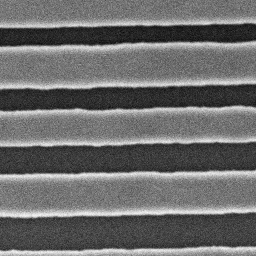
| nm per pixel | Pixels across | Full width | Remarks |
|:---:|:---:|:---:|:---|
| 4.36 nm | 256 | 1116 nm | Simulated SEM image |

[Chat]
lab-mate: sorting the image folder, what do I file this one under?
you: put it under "lines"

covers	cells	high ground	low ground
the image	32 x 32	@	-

@@@@@@@@@@@@@@@@@@@@@@@@@@@@@@@@
@@@@@@@@@@@@@@@@@@@@@@@@@@@@@@@@
@@@@@@@@@@@@@@@@@@@@@@@@@@@@@@@@
--------------------------------
--------------------------------
-----------------@@@@@@@@@@@@@@@
@@@@@@@@@@@@@@@@@@@@@@@@@@@@@@@@
@@@@@@@@@@@@@@@@@@@@@@@@@@@@@@@@
@@@@@@@@@@@@@@@@@@@@@@@@@@@@@@@@
@@@@@@@@@@@@@@@@@@@@@@@@@@@@@@@@
@@@@@@@@@@@@@@@@@@@@@@@@@@-@@---
--------------------------------
--------------------------------
-----------------------@@@-@@@@@
@@@@@@@@@@@@@@@@@@@@@@@@@@@@@@@@
@@@@@@@@@@@@@@@@@@@@@@@@@@@@@@@@
@@@@@@@@@@@@@@@@@@@@@@@@@@@@@@@@
@@@@@@@@@@@@@@@@@@@@@@@@@@@@@@@@
--------------------------------
--------------------------------
--------------------------------
----------------------------@@@@
@@@@@@@@@@@@@@@@@@@@@@@@@@@@@@@@
@@@@@@@@@@@@@@@@@@@@@@@@@@@@@@@@
@@@@@@@@@@@@@@@@@@@@@@@@@@@@@@@@
@@@@@@@@@@@@@@@@@@@@@@@@@@@@@@@@
@@@@@@@@@@@@@@@@@@@@@@@@@@@@@@@-
--------------------------------
--------------------------------
--------------------------------
--------------------------------
@@@@@@@@@@@@@@@@@@@@@@@@@@@@@@@@